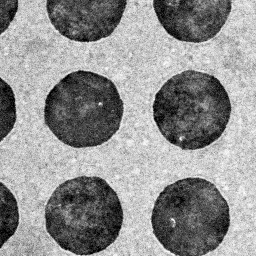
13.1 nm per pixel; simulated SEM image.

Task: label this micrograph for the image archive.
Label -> holes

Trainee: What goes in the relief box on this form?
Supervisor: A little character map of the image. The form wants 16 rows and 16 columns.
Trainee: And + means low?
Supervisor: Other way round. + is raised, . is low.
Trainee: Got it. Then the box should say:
.++.....++....++
.++....+++....++
++++..+++++..+++
++++++++++++++++
++++..+++++..+++
.++....+++....++
.++.....++....++
.++.....++....++
+++....+++....++
++++++++++++++++
++++++++++++++++
++++...++++..+++
.++....+++....++
.++.....+.....++
.++....+++....++
++++...+++....++